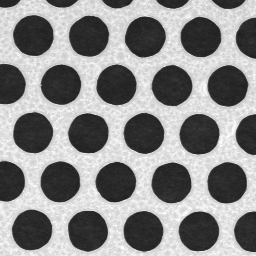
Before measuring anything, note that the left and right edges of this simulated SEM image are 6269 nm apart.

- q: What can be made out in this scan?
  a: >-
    a regular array of holes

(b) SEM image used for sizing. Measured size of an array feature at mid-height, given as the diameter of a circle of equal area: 990 nm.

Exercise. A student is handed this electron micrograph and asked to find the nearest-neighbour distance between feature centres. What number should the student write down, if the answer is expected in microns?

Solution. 1.36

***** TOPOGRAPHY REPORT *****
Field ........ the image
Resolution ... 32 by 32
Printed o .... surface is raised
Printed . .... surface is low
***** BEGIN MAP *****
..oooo...oooo...oooo...oooo...oo
oooooooooooooooooooooooooooooooo
ooo...oooo...oooo...oooo..ooooo.
oo.....oo....ooo....ooo....ooo..
oo.....oo.....oo.....oo.....o...
oo.....oo....ooo.....oo....ooo..
ooo...ooo....ooo....ooo....ooo..
oooooooooooooooooooooooooooooooo
..oooo...oooo...oooo...oooo...oo
...oo.....oo.....oo.....oo.....o
...oo.....oo.....oo.....oo.....o
...oo.....oo.....oo.....oo.....o
..oooo...oooo...oooo...oooo...oo
oooooooooooooooooooooooooooooooo
ooo...oooo..ooooo..ooooo..ooooo.
oo....ooo....ooo....ooo....ooo..
oo.....oo.....o......o.....oo...
oo....ooo....ooo....ooo....ooo..
oo....ooo....ooo....ooo....ooo..
oooooooooooooooooooooooooooooooo
..oooo...ooooo..ooooo.oooooo.ooo
...oo.....oo.....oo.....oo.....o
...oo.....oo.....oo.....oo.....o
...oo.....oo.....oo.....oo.....o
..oooo...oooo...oooo...ooo....oo
oooooooooooooooooooooooooooooooo
ooo..ooooo..ooooo..oooooo.ooooo.
oo....ooo....ooo....ooo....ooo..
oo.....o.....ooo....oo.....oo...
oo....ooo....ooo....oo.....oo...
oo....ooo....ooo....ooo....ooo..
ooooooooooooooooooooooooooooooo.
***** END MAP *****